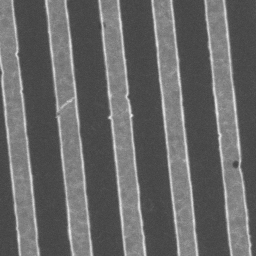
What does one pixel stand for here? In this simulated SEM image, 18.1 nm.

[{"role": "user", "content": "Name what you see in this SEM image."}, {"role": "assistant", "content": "parallel lines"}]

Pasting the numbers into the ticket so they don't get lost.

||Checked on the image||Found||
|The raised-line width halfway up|350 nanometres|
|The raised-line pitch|949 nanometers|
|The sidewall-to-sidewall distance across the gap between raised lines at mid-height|602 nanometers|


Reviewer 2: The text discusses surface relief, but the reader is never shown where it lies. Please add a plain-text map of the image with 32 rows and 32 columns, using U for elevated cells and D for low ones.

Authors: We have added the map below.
UUDDDDUUDDDDUUUDDDDUUDDDDDUUDDDD
UUDDDDUUDDDDDUUDDDDUUUDDDDUUDDDD
UUDDDDUUDDDDDUUDDDDUUUDDDDUUDDDD
UUDDDDUUUDDDDUUDDDDUUUDDDDUUDDDD
UUDDDDUUUDDDDUUDDDDDUUDDDDUUDDDD
UUDDDDUUUDDDDUUDDDDDUUDDDDUUUDDD
UUDDDDUUUDDDDUUDDDDDUUDDDDUUUDDD
UUDDDDDUUDDDDUUUDDDDUUDDDDUUUDDD
UUDDDDDUUDDDDUUUDDDDUUDDDDDUUDDD
UUUDDDDUUDDDDUUUDDDDUUDDDDDUUDDD
UUUDDDDUUDDDDDUUDDDDUUDDDDDUUDDD
UUUDDDDUUDDDDDUUDDDDUUUDDDDUUDDD
DUUDDDDUUDDDDDUUDDDDUUUDDDDUUDDD
DUUDDDDUUUDDDDUUDDDDUUUDDDDUUDDD
DUUDDDDUUUDDDDUUDDDDDUUDDDDUUDDD
DUUDDDDUUUDDDDUUDDDDDUUDDDDUUUDD
DUUDDDDUUUDDDDUUUDDDDUUDDDDUUUDD
DUUDDDDDUUDDDDUUUDDDDUUDDDDUUUDD
DUUDDDDDUUDDDDUUUDDDDUUDDDDUUUDD
DUUUDDDDUUDDDDUUUDDDDUUDDDDDUUDD
DUUUDDDDUUDDDDDUUDDDDUUDDDDDUUDD
DUUUDDDDUUDDDDDUUDDDDUUUDDDDUUDD
DDUUDDDDUUUDDDDUUDDDDUUUDDDDUUDD
DDUUDDDDUUUDDDDUUDDDDUUUDDDDUUDD
DDUUDDDDUUUDDDDUUDDDDDUUDDDDUUUD
DDUUDDDDUUUDDDDUUDDDDDUUDDDDUUUD
DDUUDDDDDUUDDDDUUUDDDDUUDDDDUUUD
DDUUDDDDDUUDDDDUUUDDDDUUDDDDUUUD
DDUUUDDDDUUDDDDUUUDDDDUUDDDDDUUD
DDUUUDDDDUUDDDDUUUDDDDUUDDDDDUUD
DDUUUDDDDUUDDDDUUUDDDDUUUDDDDUUD
DDUUUDDDDUUDDDDDUUDDDDUUUDDDDUUD